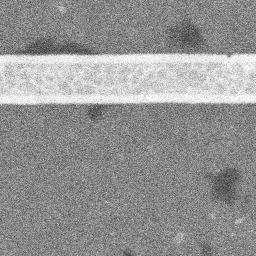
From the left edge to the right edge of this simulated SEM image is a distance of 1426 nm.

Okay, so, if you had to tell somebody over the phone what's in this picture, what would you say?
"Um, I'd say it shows one or a few lines or trenches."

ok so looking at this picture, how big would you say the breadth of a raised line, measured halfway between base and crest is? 228 nanometers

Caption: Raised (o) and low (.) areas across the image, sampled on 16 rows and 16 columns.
................
................
................
................
oooooooooooooooo
oooooooooooooooo
................
................
................
................
................
................
................
................
................
................